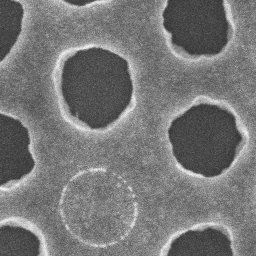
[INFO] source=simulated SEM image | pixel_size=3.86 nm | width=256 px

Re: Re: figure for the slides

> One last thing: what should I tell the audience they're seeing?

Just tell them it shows holes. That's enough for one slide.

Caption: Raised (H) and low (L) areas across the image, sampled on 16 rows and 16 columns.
LHHHHHHHHHLLLLHH
LHHHHHHHHHLLLLHH
LHHHHHHHHHHLLLHH
HHHHLLLHHHHHLHHH
HHHHLLLLHHHHHHHH
HHHHLLLLHHHHHHHH
HHHHLLLLHHHHHHHH
LHHHHLLHHHHLLLLH
LLHHHHHHHHHLLLLH
LLHHHHHHHHHLLLLH
LLHHHHHHHHHHLLHH
LHHHHHHHHHHHHHHH
HHHHHHHHHHHHHHHH
HHHHHHHHHHHHHHHH
LLHHHHHHHHHHLLHH
LLLHHHHHHHHLLLHH